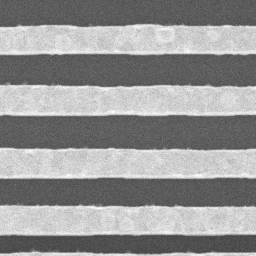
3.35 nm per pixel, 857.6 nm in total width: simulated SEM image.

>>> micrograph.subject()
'lines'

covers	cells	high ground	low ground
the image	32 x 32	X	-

--------------------------------
--------------------------------
--------------------------------
XXXXXXXXXXXXXXXXXXXXXXXXXXXXXXXX
XXXXXXXXXXXXXXXXXXXXXXXXXXXXXXXX
XXXXXXXXXXXXXXXXXXXXXXXXXXXXXXXX
XXXXXXXXXXXXXXXXXXXXXXXXXXXXXXXX
--------------------------------
--------------------------------
--------------------------------
--------------------------------
XXXXXXXXXXXXXXXXXXXXXXXXXXXXXXXX
XXXXXXXXXXXXXXXXXXXXXXXXXXXXXXXX
XXXXXXXXXXXXXXXXXXXXXXXXXXXXXXXX
--------------------------------
--------------------------------
--------------------------------
--------------------------------
--------------------------------
XXXXXXXXXXXXXXXXXXXXXXXXXXXXXXXX
XXXXXXXXXXXXXXXXXXXXXXXXXXXXXXXX
XXXXXXXXXXXXXXXXXXXXXXXXXXXXXXXX
--------------------------------
--------------------------------
--------------------------------
--------------------------------
XXXXXXXXXXXXXXXXXXXXXXXXXXXXXXXX
XXXXXXXXXXXXXXXXXXXXXXXXXXXXXXXX
XXXXXXXXXXXXXXXXXXXXXXXXXXXXXXXX
--------------------------------
--------------------------------
--------------------------------